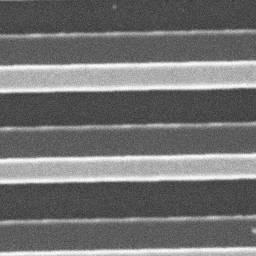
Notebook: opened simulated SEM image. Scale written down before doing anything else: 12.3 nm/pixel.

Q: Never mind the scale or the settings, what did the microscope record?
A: lines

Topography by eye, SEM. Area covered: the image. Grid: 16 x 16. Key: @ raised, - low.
----------------
----------------
@@@@@@@@@@@@@@@@
@@@@@@@@@@@@@@@@
@@@@@@@@@@@@@@@@
@@@@@@@@@@------
----------------
----------------
@@@@@@@@@@@@@@@@
@@@@@@@@@@@@@@@@
@@@@@@@@@@@@@@@@
----------------
----------------
----------------
@@@@@@@@@@@@@@@@
@@@@@@@@@@@@@@@@